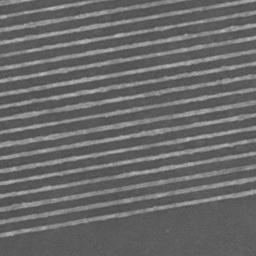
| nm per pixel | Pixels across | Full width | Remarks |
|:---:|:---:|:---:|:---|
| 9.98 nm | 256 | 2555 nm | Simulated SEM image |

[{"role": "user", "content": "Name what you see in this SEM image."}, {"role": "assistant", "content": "parallel lines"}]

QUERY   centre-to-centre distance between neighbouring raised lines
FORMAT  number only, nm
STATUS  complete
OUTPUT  126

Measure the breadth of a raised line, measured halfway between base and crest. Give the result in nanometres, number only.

29.6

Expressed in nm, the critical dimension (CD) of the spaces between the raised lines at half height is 94.8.